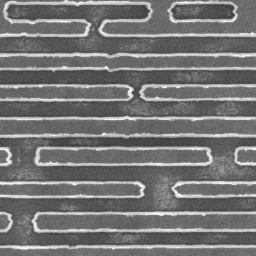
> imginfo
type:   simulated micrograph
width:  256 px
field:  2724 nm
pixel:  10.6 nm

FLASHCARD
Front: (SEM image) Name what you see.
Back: parallel lines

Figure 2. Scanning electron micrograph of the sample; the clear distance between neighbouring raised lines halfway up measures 16.9 pixels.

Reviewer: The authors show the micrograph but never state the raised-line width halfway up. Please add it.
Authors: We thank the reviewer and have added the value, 158 nm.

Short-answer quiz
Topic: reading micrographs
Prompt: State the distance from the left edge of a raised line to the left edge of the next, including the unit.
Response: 343 nm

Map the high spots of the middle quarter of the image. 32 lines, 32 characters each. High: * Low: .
********************************
...........*....................
................................
................................
................................
******.********.....******.*****
*****************..*************
*****************..*************
*****************...************
................................
................................
................................
................................
...............*................
********************************
********************************
********************************
********************************
................................
................................
................................
********************************
********************************
********************************
********************************
................................
................................
................................
................................
................................
********************........****
********************.......*****